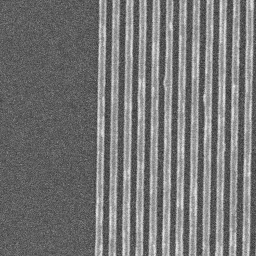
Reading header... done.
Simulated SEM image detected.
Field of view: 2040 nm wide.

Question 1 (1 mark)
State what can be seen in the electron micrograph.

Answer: parallel lines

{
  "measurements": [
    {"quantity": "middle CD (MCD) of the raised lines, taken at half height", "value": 40.8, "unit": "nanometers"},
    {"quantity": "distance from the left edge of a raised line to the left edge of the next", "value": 13.4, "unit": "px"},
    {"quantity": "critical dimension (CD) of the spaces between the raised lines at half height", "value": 61.7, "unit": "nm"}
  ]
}